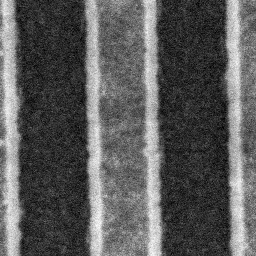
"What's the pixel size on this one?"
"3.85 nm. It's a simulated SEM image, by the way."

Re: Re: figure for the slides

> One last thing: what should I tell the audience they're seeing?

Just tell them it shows one or a few lines or trenches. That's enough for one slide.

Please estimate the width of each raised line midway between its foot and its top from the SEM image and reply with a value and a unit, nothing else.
225 nm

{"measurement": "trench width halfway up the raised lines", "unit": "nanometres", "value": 317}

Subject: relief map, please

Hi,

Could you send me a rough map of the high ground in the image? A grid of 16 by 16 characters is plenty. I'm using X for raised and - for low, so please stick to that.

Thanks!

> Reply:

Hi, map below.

X-----XXX------X
X-----XXX------X
X-----XXX------X
X-----XXX------X
X-----XXX------X
X-----XXX------X
X-----XXXX-----X
X-----XXX------X
X-----XXXX-----X
X-----XXX------X
X-----XXXX-----X
X-----XXXX-----X
X-----XXXX-----X
X-----XXXX-----X
X-----XXXX-----X
X-----XXXX-----X